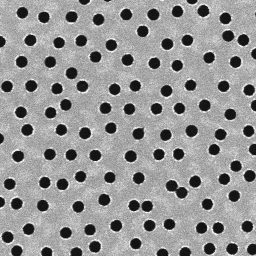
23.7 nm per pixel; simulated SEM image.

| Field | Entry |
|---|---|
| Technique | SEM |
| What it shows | a regular array of holes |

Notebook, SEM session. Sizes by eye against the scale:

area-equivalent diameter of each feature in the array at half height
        0.286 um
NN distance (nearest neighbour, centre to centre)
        512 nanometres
